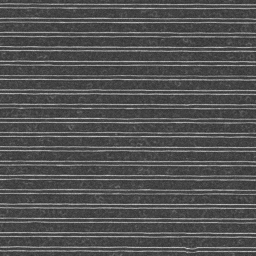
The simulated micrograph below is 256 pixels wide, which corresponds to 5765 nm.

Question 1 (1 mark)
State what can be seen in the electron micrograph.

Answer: parallel lines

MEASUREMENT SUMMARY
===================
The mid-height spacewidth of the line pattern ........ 0.236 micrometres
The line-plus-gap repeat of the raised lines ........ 322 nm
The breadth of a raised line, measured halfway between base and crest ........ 90.1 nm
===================